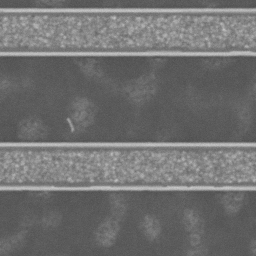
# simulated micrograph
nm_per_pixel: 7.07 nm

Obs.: one or a few lines or trenches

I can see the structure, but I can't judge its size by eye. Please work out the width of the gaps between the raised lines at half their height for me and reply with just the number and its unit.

90 px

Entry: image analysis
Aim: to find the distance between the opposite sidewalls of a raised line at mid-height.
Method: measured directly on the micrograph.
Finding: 44.1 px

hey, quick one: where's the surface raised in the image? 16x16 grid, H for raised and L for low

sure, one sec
LLLLLLLLLLLLLLLL
HHHHHHHHHHHHHHHH
HHHHHHHHHHHHHHHH
LLLLLLLLLLLLLLLL
LLLLLLLLLLLLLLLL
LLLLLLLLLLLLLLLL
LLLLLLLLLLLLLLLL
LLLLLLLLLLLLLLLL
LLLLLLLLLLLLLLLL
HHHHHHHHHHHHHHHH
HHHHHHHHHHHHHHHH
HHHHHHHHHHHHHHHH
LLLLLLLLLLLLLLLL
LLLLLLLLLLLLLLLL
LLLLLLLLLLLLLLLL
LLLLLLLLLLLLLLLL